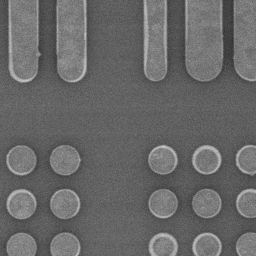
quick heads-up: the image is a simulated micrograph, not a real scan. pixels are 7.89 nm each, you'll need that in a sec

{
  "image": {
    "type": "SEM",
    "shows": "groups of lines, slits or small figures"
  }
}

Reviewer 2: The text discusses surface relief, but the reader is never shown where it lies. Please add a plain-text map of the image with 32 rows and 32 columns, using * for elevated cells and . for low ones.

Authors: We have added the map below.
.****..****.......***..*****.***
.****..****.......***..*****.***
.****..****.......***..*****.***
.****..****.......***..*****.***
.****..****.......***..*****.***
.****..****.......***..*****.***
.****..****.......***..*****.***
.****..****.......***..*****.***
.****..****.......***..*****.***
..**....**........***...***...**
................................
................................
................................
................................
................................
................................
................................
................................
..**...**...........*....*.....*
.***..****.........***..***...**
.***..****.........***..***...**
..**...**...........*....**....*
................................
................................
.***...***.........***..***...**
.***..****.........***..***...**
.***...***.........***...**...**
................................
................................
..**...**...........*....**...**
.***..****.........***..***...**
.***..****.........***..***...**